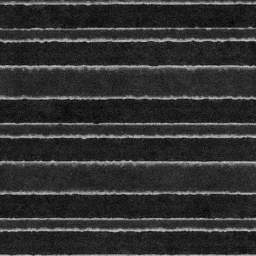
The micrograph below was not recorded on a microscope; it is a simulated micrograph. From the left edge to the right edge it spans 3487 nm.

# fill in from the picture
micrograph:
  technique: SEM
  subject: lines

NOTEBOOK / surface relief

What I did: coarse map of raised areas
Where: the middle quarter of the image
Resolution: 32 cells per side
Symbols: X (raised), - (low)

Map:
--------------------------------
XXXXXXXXXXXXXXXXXXXXXXXXXXXXXXXX
XXXXXXXXXXXXXXXXXXXXXXXXXXXXXXXX
XXXXXXXXXXXXXXXXXXXXXXXXXXXXXXXX
XXXXXXXXXXXXXXXXXXXXXXXXXXXXXXXX
XXXXXXXXXXXXXXXXXXXXXXXXXXXXXXXX
XXXXXXXXXXXXXXXXXXXXXXXXXXXXXXXX
XXXXXXXXXXXXXXXXXXXXXXXXXXXXXXXX
XXXXXX-XXXX------XX--XXXXXXXX--X
--------------------------------
--------------------------------
--------------------------------
--------------------------------
--------------------------------
--------------------------------
XXXXXXXXXXXXXXXXXXXXXXXXXXXXXXXX
XXXXXXXXXXXXXXXXXXXXXXXXXXXXXXXX
XXXXXXXXXXXXXXXXXXXXXXXXXXXXXXXX
--------------------------------
--------------------------------
--------------------------------
--------------------------------
--------------------------------
--------------------------------
------------X-------------------
XXXXXXXXXXXXXXXXXXXXXXXXXXXXXXXX
XXXXXXXXXXXXXXXXXXXXXXXXXXXXXXXX
XXXXXXXXXXXXXXXXXXXXXXXXXXXXXXXX
XXXXXXXXXXXXXXXXXXXXXXXXXXXXXXXX
XXXXXXXXXXXXXXXXXXXXXXXXXXXXXXXX
XXXXXXXXXXXXXXXXXXXXXXXXXXXXXXXX
XXXXXXXXXXXXXXXXXXXXXXXXXXXXXXXX